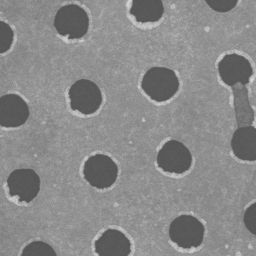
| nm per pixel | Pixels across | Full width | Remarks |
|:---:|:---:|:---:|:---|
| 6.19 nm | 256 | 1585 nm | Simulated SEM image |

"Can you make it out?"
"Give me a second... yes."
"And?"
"a regular array of holes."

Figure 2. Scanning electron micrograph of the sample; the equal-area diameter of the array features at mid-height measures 0.214 um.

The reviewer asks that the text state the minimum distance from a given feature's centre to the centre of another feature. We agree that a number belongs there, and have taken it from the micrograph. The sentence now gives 468 nm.